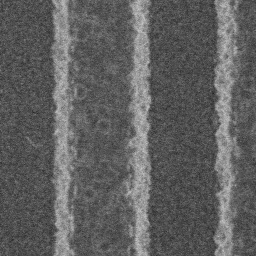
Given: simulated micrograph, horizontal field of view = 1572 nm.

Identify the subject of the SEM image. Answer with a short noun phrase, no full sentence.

one or a few lines or trenches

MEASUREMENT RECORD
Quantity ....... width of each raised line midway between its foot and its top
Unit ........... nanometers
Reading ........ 477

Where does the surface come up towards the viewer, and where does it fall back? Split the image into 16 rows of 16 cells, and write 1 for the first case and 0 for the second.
0000111110000011
0000111110000011
0000111110000011
0000111110000011
0000111110000011
0000111110000011
0000111110000011
0000111110000011
0000111110000011
0000111110000011
0000111110000011
0000111110000011
0000111110000011
0000111110000011
0000111110000011
0000111110000011